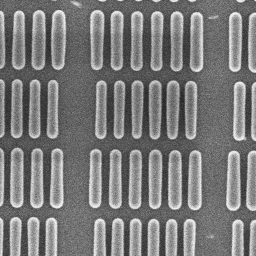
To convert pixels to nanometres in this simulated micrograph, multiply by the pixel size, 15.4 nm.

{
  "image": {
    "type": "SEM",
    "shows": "groups of lines, slits or small figures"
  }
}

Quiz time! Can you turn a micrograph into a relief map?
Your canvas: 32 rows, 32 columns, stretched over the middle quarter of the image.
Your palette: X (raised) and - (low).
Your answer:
-------XX---XX---XX---XX---XX---
---------------------------XX---
--------------------------------
--------------------------------
---------X---XX--XX---XX--XX---X
--------XX---XX--XXX-XXX--XXX-XX
--------XX---XX--XXX-XXX--XXX-XX
--------XX---XX--XXX-XXX--XXX-XX
--------XX---XX--XXX-XXX--XXX-XX
--------XX---XX--XXX-XXX--XXX-XX
--------XX---XX--XXX-XXX--XXX-XX
--------XX---XX--XX--XXX--XXX-XX
--------XX---XX--XX--XXX--XX--XX
--------XX---XX--XX--XXX--XX--XX
--------XX---XX--XX--XXX--XX--XX
--------XX---XX--XX--XXX--XX--XX
--------XX---XX--XX--XXX--XX--XX
--------XX---XX--XX--XXX--XX--XX
----------------------X----X---X
--------------------------------
--------------------------------
-------XX---X----X----X---------
-------XX---XX---XX--XXX--XXX--X
-------XX---XX---XX--XXX--XXX--X
-------XX---XX--XXX--XXX--XXX--X
-------XX---XX--XXX--XXX--XXX--X
-------XX---XX--XXX--XXX--XXX--X
-------XX---XX--XXX--XXX--XXX--X
------XXX--XXX--XXX--XXX--XXX--X
------XXX--XXX--XXX--XXX--XXX--X
------XXX--XXX--XXX--XXX--XXX--X
------XXX--XXX--XXX--XXX--XXX--X